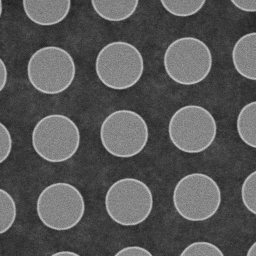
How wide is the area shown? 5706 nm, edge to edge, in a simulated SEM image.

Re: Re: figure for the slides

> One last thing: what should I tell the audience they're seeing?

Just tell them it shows an array of small figures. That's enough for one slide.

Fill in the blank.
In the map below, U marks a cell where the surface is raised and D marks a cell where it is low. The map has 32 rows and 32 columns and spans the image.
DDDUUUUUUDDDUUUUUDDDUUUUUDDDDUUU
DDDUUUUUDDDDUUUUUDDDDUUUDDDDDDDD
DDDDUUUUDDDDDDUDDDDDDDDDDDDDDDDD
DDDDDDDDDDDDDDDDDDDDDDDDDDDDDDDD
DDDDDDDDDDDDDDDDDDDDDDDDDDDDDDUU
DDDDDDDDDDDDDDUUDDDDDUUUUUDDDDUU
DDDDDUUUDDDDDUUUUDDDDUUUUUDDDUUU
DDDDUUUUUDDDUUUUUUDDDUUUUUDDDUUU
UDDDUUUUUDDDUUUUUUDDDUUUUUDDDUUU
UDDDUUUUUDDDUUUUUUDDDUUUUUDDDDUU
UDDDUUUUUDDDDUUUUDDDDDDUDDDDDDDD
DDDDDUUDDDDDDDDDDDDDDDDDDDDDDDDD
DDDDDDDDDDDDDDDDDDDDDDDDDDDDDDDD
DDDDDDDDDDDDDDDDDDDDDDDUUDDDDDUU
DDDDDDUUDDDDDDUUUDDDDDUUUUDDDDUU
DDDDDUUUUDDDDUUUUUDDDUUUUUUDDDUU
UDDDUUUUUUDDDUUUUUDDDUUUUUUDDDUU
UDDDUUUUUUDDDUUUUUDDDUUUUUUDDDUU
UDDDUUUUUUDDDUUUUUDDDDUUUUDDDDDD
UDDDDUUUUDDDDDDUDDDDDDDDDDDDDDDD
DDDDDDDDDDDDDDDDDDDDDDDDDDDDDDDD
DDDDDDDDDDDDDDDDDDDDDDDDDDDDDDDD
DDDDDDDDDDDDDDDUUDDDDDDUUUUDDDDU
DDDDDDUUUDDDDDUUUUDDDDUUUUUDDDUU
UDDDDUUUUUDDDUUUUUUDDDUUUUUDDDUU
UUDDDUUUUUDDDUUUUUUDDDUUUUUDDDDU
UUDDDUUUUUDDDUUUUUUDDDUUUUUDDDDD
UUDDDUUUUUDDDDUUUUDDDDDDUDDDDDDD
UDDDDDUUUDDDDDDDDDDDDDDDDDDDDDDD
DDDDDDDDDDDDDDDDDDDDDDDDDDDDDDDD
DDDDDDDDDDDDDDDDDDDDDDDDUUDDDDDD
DDDDDDDDUDDDDDDUUUUDDDDUUUUUDDDU